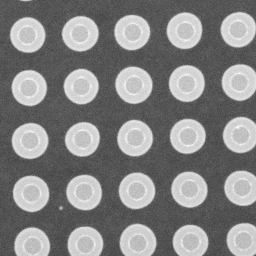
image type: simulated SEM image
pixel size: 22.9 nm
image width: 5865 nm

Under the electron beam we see an array of small figures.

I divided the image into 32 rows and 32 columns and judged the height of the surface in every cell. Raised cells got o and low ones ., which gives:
................................
................................
..oo.....oo....ooo...oooo...oooo
..ooo...oooo..ooooo..oooo...oooo
.ooooo..oooo..ooooo..oooo...oooo
..ooo...oooo...ooo....oo.....oo.
...o............................
................................
................o.....oo.....oo.
..ooo....ooo...oooo..oooo...oooo
..oooo..oooo...oooo..oooo...oooo
..oooo..oooo...oooo..oooo...oooo
..ooo....oo....ooo....oo.....o..
................................
................................
...o......o.....oo....ooo...oooo
..oooo..oooo...oooo..ooooo..oooo
..oooo..oooo...oooo..ooooo..oooo
..oooo..oooo...oooo...ooo....ooo
...oo...........................
................................
.............................oo.
..ooo....ooo...oooo...ooo...oooo
..oooo..ooooo..oooo...oooo..oooo
..oooo..ooooo..oooo...oooo..oooo
..oooo...ooo....ooo...ooo.....o.
................................
................................
..........o.....oo.....oo....ooo
..oooo...oooo..oooo...oooo..oooo
..oooo...oooo..oooo...oooo..oooo
..oooo...oooo..oooo...oooo...ooo